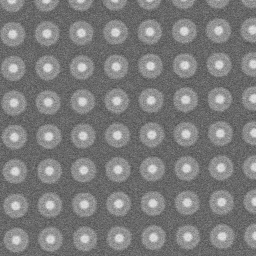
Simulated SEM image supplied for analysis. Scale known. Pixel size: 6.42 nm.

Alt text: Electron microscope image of an array of small figures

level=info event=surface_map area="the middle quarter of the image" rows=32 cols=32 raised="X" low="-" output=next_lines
--XXXXX---XXXXXX---XXXXX---XXXXX
--XXXXX---XXXXXX---XXXXX---XXXXX
--XXXXX----XXXX----XXXXX----XXXX
---XXX------XX-------X----------
--------------------------------
--------------------------------
----X-------XX------XXX------XXX
--XXXXX----XXXXX---XXXXX----XXXX
--XXXXX---XXXXXX---XXXXXX--XXXXX
--XXXXXX--XXXXXX---XXXXXX--XXXXX
--XXXXX---XXXXXX---XXXXX----XXXX
--XXXXX----XXXX-----XXXX-----XXX
--------------------------------
--------------------------------
--------------------------------
---XXX-----XXXX-----XXXX----XXXX
--XXXXX----XXXXX---XXXXXX---XXXX
--XXXXXX--XXXXXX---XXXXXX---XXXX
--XXXXXX--XXXXXX---XXXXXX---XXXX
--XXXXX----XXXXX----XXXX----XXXX
---XXX------XXX------XX---------
--------------------------------
--------------------------------
-------------X-------XX------XXX
---XXXX----XXXXX----XXXXX---XXXX
--XXXXXX---XXXXX---XXXXXX---XXXX
--XXXXXX---XXXXX---XXXXXX---XXXX
--XXXXXX---XXXXX---XXXXXX---XXXX
---XXXX----XXXXX----XXXX-----XXX
--------------------------------
--------------------------------
--------------------------------